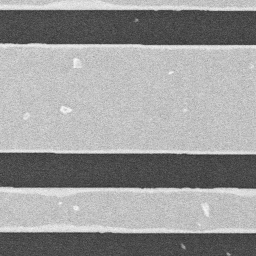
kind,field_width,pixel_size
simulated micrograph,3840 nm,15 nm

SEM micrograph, lines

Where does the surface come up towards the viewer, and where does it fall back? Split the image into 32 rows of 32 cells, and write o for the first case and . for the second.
oooooooooooooooooooooooooooooooo
................................
................................
................................
................................
................................
oooooooooooooooooooooooooooooooo
oooooooooooooooooooooooooooooooo
oooooooooooooooooooooooooooooooo
oooooooooooooooooooooooooooooooo
oooooooooooooooooooooooooooooooo
oooooooooooooooooooooooooooooooo
oooooooooooooooooooooooooooooooo
oooooooooooooooooooooooooooooooo
oooooooooooooooooooooooooooooooo
oooooooooooooooooooooooooooooooo
oooooooooooooooooooooooooooooooo
oooooooooooooooooooooooooooooooo
oooooooooooooooooooooooooooooooo
................................
................................
................................
................................
................................
oooooooooooooooooooooooooooooooo
oooooooooooooooooooooooooooooooo
oooooooooooooooooooooooooooooooo
oooooooooooooooooooooooooooooooo
oooooooooooooooooooooooooooooooo
................................
................................
................................